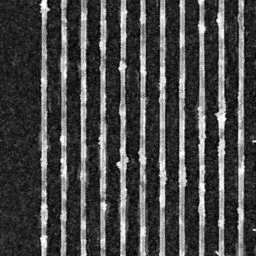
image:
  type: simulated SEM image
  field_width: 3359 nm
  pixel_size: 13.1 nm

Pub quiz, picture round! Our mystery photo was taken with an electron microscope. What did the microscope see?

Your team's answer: parallel lines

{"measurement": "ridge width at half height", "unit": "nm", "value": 54.1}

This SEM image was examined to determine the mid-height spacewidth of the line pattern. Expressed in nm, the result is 203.